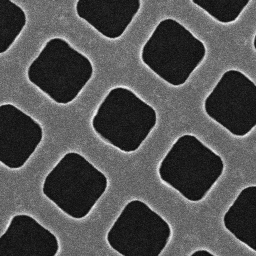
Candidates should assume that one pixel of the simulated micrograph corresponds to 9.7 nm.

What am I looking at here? holes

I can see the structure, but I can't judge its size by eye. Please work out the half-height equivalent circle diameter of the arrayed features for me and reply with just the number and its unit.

0.577 micrometres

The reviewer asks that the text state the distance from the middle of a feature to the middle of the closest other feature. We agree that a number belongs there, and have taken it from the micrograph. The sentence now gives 0.795 µm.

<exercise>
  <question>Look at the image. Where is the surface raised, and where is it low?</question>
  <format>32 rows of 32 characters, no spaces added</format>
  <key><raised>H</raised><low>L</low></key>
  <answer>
LLHHHHHHHHLLLLLLLLHHHHHHHLLLLLLH
LLLHHHHHHHLLLLLLLHHHHHHHHHLLLLHH
LLLHHHHHHHHLLLLLLHHHHLHHHHHLLHHH
LLLHHHHHHHHHLLLLHHHHLLLHHHHHHHHH
LLHHHHHHHHHHHLLHHHHLLLLLHHHHHHHH
LHHHHHLLLHHHHHHHHHLLLLLLLHHHHHHH
HHHHHLLLLLHHHHHHHHLLLLLLLLHHHHHH
HHHHLLLLLLLHHHHHHHLLLLLLLHHHHHHH
HHHHLLLLLLLLHHHHHHHLLLLLHHHHHHHH
HHHHLLLLLLLHHHHHHHHHLLLLHHHHLLLH
HHHHLLLLLLLHHHHHHHHHHLLHHHHLLLLL
HHHHHHLLLLHHHHLLLHHHHHHHHHLLLLLL
HHHHHHHLLHHHHLLLLLHHHHHHHHLLLLLL
LLHHHHHHHHHHLLLLLLLHHHHHHHLLLLLL
LLLLHHHHHHHHLLLLLLLLHHHHHHLLLLLL
LLLLLHHHHHHHLLLLLLLHHHHHHHHLLLLL
LLLLLHHHHHHHLLLLLLLHHHHHHHHHHLLH
LLLLLHHHHHHHHLLLLLHHHHLLLHHHHHHH
LLLLLHHHHHHHHHHLLHHHHLLLLLHHHHHH
LLLLHHHHLLHHHHHHHHHHHLLLLLLHHHHH
HLLHHHHLLLLHHHHHHHHHLLLLLLLLHHHH
HHHHHHLLLLLLLHHHHHHHLLLLLLLLHHHH
HHHHHHLLLLLLLHHHHHHHLLLLLLLHHHHH
HHHHHLLLLLLLLHHHHHHHHHLLLLHHHHHL
HHHHHHLLLLLLLHHHHHHHHHHLLLHHHHLL
HHHHHHHLLLLLHHHHLLHHHHHHHHHHHLLL
HHHHHHHHLLLHHHHLLLLHHHHHHHHHLLLL
HLLLHHHHHHHHHHHLLLLLHHHHHHHHLLLL
HLLLLLHHHHHHHHLLLLLLLHHHHHHHLLLL
LLLLLLLHHHHHHLLLLLLLLHHHHHHHHLLL
LLLLLLLHHHHHHHLLLLLLLHHHHHHHHHHL
LLLLLLLHHHHHHHHLLLLLHHHHLLHHHHHH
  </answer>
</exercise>